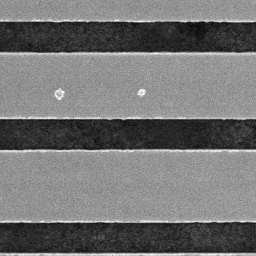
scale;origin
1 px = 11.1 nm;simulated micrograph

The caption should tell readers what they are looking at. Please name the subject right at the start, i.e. lines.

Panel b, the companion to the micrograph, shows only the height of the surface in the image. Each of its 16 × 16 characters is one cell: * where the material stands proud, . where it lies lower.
****************
................
................
****************
****************
****************
****************
................
................
****************
****************
****************
****************
****************
................
................